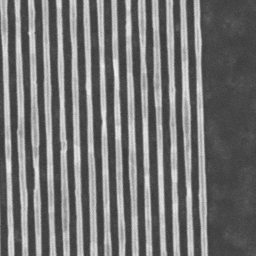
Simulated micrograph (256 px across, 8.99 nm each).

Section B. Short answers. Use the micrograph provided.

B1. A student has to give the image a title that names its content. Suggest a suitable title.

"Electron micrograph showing parallel lines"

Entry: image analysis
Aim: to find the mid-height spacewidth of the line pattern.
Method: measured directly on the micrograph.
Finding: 86.5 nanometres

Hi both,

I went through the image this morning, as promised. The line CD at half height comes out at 39.3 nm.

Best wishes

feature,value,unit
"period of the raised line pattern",124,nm